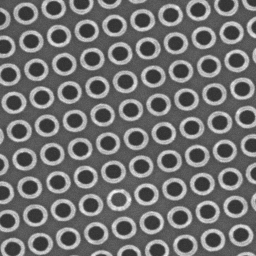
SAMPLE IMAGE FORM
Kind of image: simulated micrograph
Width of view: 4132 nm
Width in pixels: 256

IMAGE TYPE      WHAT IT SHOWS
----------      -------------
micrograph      a regular array of ring-shaped raised bodies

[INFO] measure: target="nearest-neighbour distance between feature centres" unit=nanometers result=452